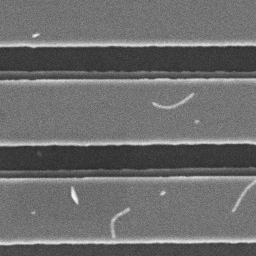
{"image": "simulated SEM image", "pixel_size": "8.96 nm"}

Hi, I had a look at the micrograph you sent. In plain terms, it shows lines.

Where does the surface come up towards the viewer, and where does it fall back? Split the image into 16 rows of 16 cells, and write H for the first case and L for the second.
HHHHHHHHHHHHHHHH
HHHHHHHHHHHHHHHH
HHHHHHHHHHHHHHHH
LLLLLLLLLLLLLLLL
LLLLLLLLLLLLLLLL
HHHHHHHHHHHHHHHH
HHHHHHHHHHHHHHHH
HHHHHHHHHHHHHHHH
HHHHHHHHHHHHHHHH
LLLLLLLLLLLLLLLL
LLLLLLLLLLLLLLLL
HHHHHHHHHHHHHHHH
HHHHHHHHHHHHHHHH
HHHHHHHHHHHHHHHH
HHHHHHHHHHHHHHHH
LLLLLLLLLLLLLLLL